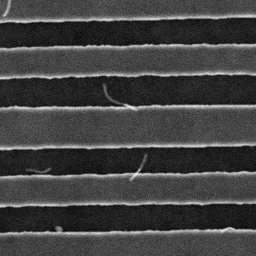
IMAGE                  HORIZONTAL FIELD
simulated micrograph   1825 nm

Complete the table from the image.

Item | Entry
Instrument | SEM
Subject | lines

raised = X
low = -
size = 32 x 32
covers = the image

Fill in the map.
XXXXXXXXXXXXXXXXXXXXXXXXXXXXXXXX
XXXXXXXXXXXXXXXXXXXXXXXXXXXXXXXX
XXXXXXXXXXXXXX------------------
--------------------------------
--------------------------------
-------------------------X------
XXXXXXXXXXXXXXXXXXXXXXXXXXXXXXXX
XXXXXXXXXXXXXXXXXXXXXXXXXXXXXXXX
XXXXXXXXXXXXXXXXXXXXXXXXXXXXXXXX
XXXXXXXXXXX-----X---------------
--------------------------------
--------------------------------
--------------------------------
-XXX-XXXXXXXXXXXXXXXXXXXXXXXXXXX
XXXXXXXXXXXXXXXXXXXXXXXXXXXXXXXX
XXXXXXXXXXXXXXXXXXXXXXXXXXXXXXXX
XXXXXXXXXXXXXXXXXXXXXXXXXXXXXXXX
XXXXXXXXXXXXXXXXXXXXXXXXXXXXXXXX
XXXXXX----XX--------------------
--------------------------------
--------------------------------
---------------------------X--X-
XXXXXXXXXXXXXXXXXXXXXXXXXXXXXXXX
XXXXXXXXXXXXXXXXXXXXXXXXXXXXXXXX
XXXXXXXXXXXXXXXXXXXXXXXXXXXXXXXX
XXXXXXXXXXXXXX-XXX-------X------
--------------------------------
--------------------------------
----------------------------X---
XXXXXXXXXXXXXXXXXXXXXXXXXXXXXXXX
XXXXXXXXXXXXXXXXXXXXXXXXXXXXXXXX
XXXXXXXXXXXXXXXXXXXXXXXXXXXXXXXX